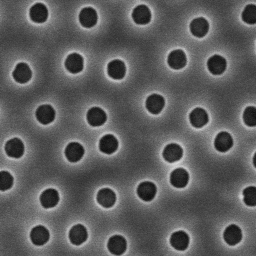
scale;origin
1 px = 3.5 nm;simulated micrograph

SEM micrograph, a regular array of holes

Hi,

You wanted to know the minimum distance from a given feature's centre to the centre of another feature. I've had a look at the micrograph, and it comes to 0.138 microns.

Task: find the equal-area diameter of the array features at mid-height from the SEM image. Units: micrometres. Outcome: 0.0737